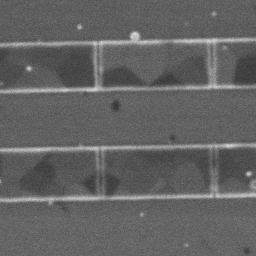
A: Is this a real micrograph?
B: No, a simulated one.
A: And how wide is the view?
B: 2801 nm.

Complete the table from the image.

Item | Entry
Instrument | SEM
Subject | wiring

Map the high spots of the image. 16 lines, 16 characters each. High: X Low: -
----------------
----------------
------------XXXX
XXXXXXXXXXXXXXXX
XXXXXXXXXXXXXXXX
XXXXX-XXXXXXX---
----------------
----------------
----------------
XXXXXXXXXXXXXXXX
XXXXXXXXXXXXXXXX
XXXXXXXXXXXXXXXX
XXX-------------
----------------
----------------
----------------